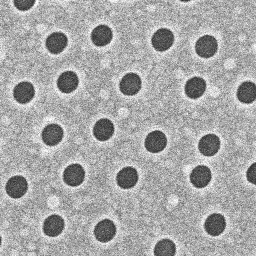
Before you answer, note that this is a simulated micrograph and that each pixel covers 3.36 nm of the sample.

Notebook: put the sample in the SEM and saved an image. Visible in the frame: a regular array of holes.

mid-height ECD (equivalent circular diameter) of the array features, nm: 76.6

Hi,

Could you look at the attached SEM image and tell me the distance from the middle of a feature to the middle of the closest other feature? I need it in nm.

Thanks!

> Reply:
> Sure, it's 153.